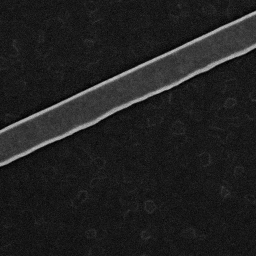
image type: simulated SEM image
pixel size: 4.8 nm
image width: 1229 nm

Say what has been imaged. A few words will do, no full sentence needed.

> one or a few lines or trenches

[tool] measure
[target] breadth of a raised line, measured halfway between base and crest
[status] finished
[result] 149 nanometres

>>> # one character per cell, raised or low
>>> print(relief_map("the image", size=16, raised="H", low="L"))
LLLLLLLLLLLLLLLL
LLLLLLLLLLLLLLHH
LLLLLLLLLLLLHHHH
LLLLLLLLLLHHHHHL
LLLLLLLLHHHHLLLL
LLLLLLHHHHHLLLLL
LLLLHHHHLLLLLLLL
LLHHHHLLLLLLLLLL
HHHHLLLLLLLLLLLL
HHLLLLLLLLLLLLLL
LLLLLLLLLLLLLLLL
LLLLLLLLLLLLLLLL
LLLLLLLLLLLLLLLL
LLLLLLLLLLLLLLLL
LLLLLLLLLLLLLLLL
LLLLLLLLLLLLLLLL